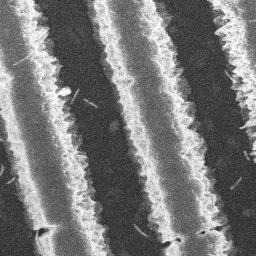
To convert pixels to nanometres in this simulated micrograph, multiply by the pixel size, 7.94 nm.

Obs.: one or a few lines or trenches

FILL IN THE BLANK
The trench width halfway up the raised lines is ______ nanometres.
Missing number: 557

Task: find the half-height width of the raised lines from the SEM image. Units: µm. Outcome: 0.384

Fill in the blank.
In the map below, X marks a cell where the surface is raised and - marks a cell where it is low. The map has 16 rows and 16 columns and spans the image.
XX----XXXX----XX
XX-----XXX----XX
XX-----XXX-----X
XXX----XXX-----X
XXX----XXXX----X
XXX-----XXX-----
XXXX----XXX-----
-XXX----XXX-----
-XXX-----XXX----
-XXX-----XXX----
--XXX----XXX----
--XXX-----XXX---
--XXX-----XXX---
--XXX-----XXX---
---XXX----XXXX--
---XXX-----XXX--